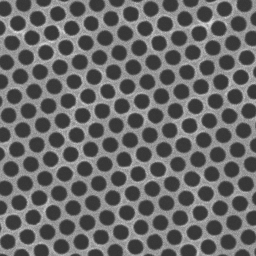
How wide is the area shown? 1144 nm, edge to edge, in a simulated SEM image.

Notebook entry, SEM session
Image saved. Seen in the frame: a regular array of holes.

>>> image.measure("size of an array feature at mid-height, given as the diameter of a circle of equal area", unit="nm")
71.9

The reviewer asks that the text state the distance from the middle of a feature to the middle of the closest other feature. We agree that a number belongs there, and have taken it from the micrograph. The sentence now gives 89.8 nanometres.